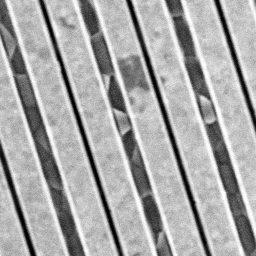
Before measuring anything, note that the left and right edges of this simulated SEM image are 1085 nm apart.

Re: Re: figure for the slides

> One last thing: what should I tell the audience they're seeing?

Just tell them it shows parallel lines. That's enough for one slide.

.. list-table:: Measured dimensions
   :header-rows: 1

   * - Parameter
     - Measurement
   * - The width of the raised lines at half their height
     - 122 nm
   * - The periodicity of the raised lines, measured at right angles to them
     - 0.177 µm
